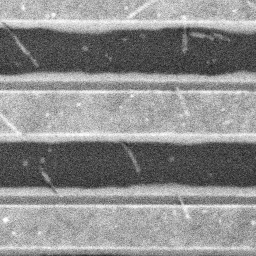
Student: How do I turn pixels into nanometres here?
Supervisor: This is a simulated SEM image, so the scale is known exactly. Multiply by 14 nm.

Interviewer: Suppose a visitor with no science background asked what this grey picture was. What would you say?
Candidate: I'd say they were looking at lines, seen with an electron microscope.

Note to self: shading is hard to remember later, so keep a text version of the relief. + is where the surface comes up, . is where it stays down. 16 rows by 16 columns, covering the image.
++++++++++++++++
................
................
................
................
++++++++++++++++
++++++++++++++++
++++++++++++++++
.+.........++++.
................
................
................
++++++++++++++++
++++++++++++++++
++++++++++++++++
++++++++++++++++